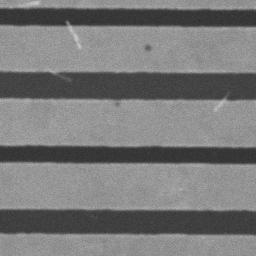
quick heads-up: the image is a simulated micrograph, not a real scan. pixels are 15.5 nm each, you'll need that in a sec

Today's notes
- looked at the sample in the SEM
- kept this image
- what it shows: lines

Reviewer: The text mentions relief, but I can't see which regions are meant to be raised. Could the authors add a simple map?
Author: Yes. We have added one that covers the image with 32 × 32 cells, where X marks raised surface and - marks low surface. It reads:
XXXXXXXXXXXXXXXXXXXXXXXXXXXXXXXX
--------------------------------
--------------------------------
XXXXXXXXXXXXXXXXXXXXXXXXXXXXXXXX
XXXXXXXXXXXXXXXXXXXXXXXXXXXXXXXX
XXXXXXXXXXXXXXXXXXXXXXXXXXXXXXXX
XXXXXXXXXXXXXXXXXXXXXXXXXXXXXXXX
XXXXXXXXXXXXXXXXXXXXXXXXXXXXXXXX
XXXXXXXXXXXXXXXXXXXXXXXXXXXXXXXX
--------------------------------
--------------------------------
--------------------------------
XXXX-XXX--------------------X---
XXXXXXXXXXXXXXXXXXXXXXXXXXXXXXXX
XXXXXXXXXXXXXXXXXXXXXXXXXXXXXXXX
XXXXXXXXXXXXXXXXXXXXXXXXXXXXXXXX
XXXXXXXXXXXXXXXXXXXXXXXXXXXXXXXX
XXXXXXXXXXXXXXXXXXXXXXXXXXXXXXXX
--------------------------------
--------------------------------
XXXXXXXXX-----------------------
XXXXXXXXXXXXXXXXXXXXXXXXXXXXXXXX
XXXXXXXXXXXXXXXXXXXXXXXXXXXXXXXX
XXXXXXXXXXXXXXXXXXXXXXXXXXXXXXXX
XXXXXXXXXXXXXXXXXXXXXXXXXXXXXXXX
XXXXXXXXXXXXXXXXXXXXXXXXXXXXXXXX
--------------------------------
--------------------------------
--------------------------------
XXXXXXXXXXXXXXXXXXXXXXXXXXXXXXXX
XXXXXXXXXXXXXXXXXXXXXXXXXXXXXXXX
XXXXXXXXXXXXXXXXXXXXXXXXXXXXXXXX